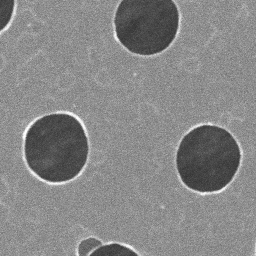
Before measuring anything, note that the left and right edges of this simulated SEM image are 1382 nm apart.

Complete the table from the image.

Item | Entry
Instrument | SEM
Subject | holes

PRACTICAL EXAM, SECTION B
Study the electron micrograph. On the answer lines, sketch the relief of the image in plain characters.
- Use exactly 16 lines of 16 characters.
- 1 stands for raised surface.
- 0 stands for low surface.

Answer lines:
0111111000011111
1111111000011111
1111111000011111
1111111111111111
1111111111111111
1111111111111111
1111111111111111
1100011111111111
1100011111110011
1100011111100001
1100011111100001
1111111111110011
1111111111111111
1111111111111111
1111111111111111
1111110011111111